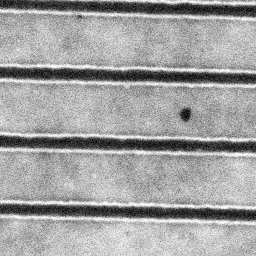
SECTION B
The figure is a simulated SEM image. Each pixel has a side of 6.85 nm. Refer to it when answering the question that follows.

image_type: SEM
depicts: lines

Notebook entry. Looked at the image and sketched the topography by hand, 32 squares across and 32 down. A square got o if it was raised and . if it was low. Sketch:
oooooooooooooooooooooooooooooooo
.....ooooooooooooooooooooooooooo
................................
................................
................................
................................
................................
................................
ooooooooooooooooooo.............
oooooooooooooooooooooooooooooooo
..................oooooooooooooo
................................
................................
................................
................................
................................
................................
oooooooooooooooooooooooooooooooo
oooooooooooooooooooooooooooooooo
................................
................................
................................
................................
................................
................................
ooooooooooooooo.................
oooooooooooooooooooooooooooooooo
.................ooooooooooooooo
................................
................................
................................
................................